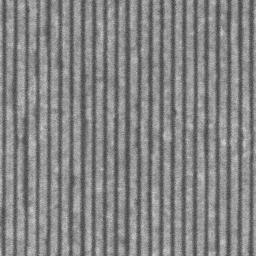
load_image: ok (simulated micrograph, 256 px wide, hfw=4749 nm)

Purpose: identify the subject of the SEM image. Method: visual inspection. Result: parallel lines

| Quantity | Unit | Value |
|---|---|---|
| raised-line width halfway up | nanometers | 97.4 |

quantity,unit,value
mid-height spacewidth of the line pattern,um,0.111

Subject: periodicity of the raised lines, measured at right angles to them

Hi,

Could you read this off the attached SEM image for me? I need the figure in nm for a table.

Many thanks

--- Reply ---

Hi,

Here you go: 209